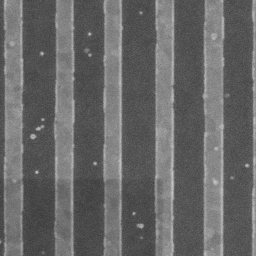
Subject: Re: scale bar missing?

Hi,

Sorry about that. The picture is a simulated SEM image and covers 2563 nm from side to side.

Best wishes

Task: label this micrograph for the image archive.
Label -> lines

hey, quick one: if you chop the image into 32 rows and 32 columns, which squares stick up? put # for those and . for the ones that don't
.##....##....##.....##....##....
.##....##....##.....##....##....
.##....##....##.....##....##....
.##....##....##.....##....##....
.##....##....##.....##....##....
.##....##....##.....##....##....
.##....##....##.....##....##....
.##....##....##.....##....##....
.##....##....##.....##....##....
.##....##....##.....##....##....
.##....##....##.....##....##....
.##....##....##....###....##....
.##....##....##.....##...###....
.##....##....##.....##....##....
.##....##....##.....##....##....
.##....##....##.....##....##....
.##....##....##.....##....##....
.##....##....##.....##....##....
.##....##....##.....##....##....
.##....##....##.....##....##....
.##....##....##.....##....##....
.##....##....##.....##....##....
.##....##....##....###....##....
.##....##....##....###....##....
.##....##....##....###....##....
.##....##....##....###....##....
.##....##....##....###....##....
.##....##....##.....##....##....
.##....##....##.....##....##....
.##....##....##.....##....##....
.##....##....##.....##....##....
.##....##....##.....##....##....